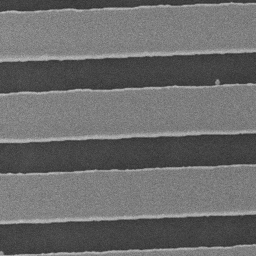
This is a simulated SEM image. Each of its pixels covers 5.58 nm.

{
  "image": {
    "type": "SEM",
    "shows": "lines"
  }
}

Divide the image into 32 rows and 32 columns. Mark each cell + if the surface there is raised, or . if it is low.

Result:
...........................+++++
+++.++++++++++++++++++++++++++++
++++++++++++++++++++++++++++++++
++++++++++++++++++++++++++++++++
++++++++++++++++++++++++++++++++
++++++++++++++++++++++++++++++++
+++++++++++++++++++++++++++++++.
+++++...........................
................................
................................
.............................+++
......++++++++++++++++++++++++++
++++++++++++++++++++++++++++++++
++++++++++++++++++++++++++++++++
++++++++++++++++++++++++++++++++
++++++++++++++++++++++++++++++++
++++++++++++++++++++++++++++++++
++++++++........................
................................
................................
................................
.........+++++++++++++++++++++++
++++++++++++++++++++++++++++++++
++++++++++++++++++++++++++++++++
++++++++++++++++++++++++++++++++
++++++++++++++++++++++++++++++++
++++++++++++++++++++++++++++++++
++++++++++++....................
................................
................................
................................
..........++++++++++++++++++++++